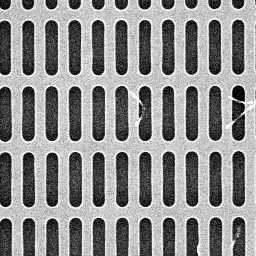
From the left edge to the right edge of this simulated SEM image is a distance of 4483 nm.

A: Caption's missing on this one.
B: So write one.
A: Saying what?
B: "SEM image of groups of lines, slits or small figures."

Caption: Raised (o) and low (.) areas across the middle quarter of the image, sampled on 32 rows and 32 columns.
o...ooo...ooo...oo....oo....oo..
o...ooo...ooo...ooo...oo....oo..
oo..oooo.oooo..oooo..oooo..oooo.
oooooooooooooooooooooooooooooooo
oooooooooooooooooooooooooooooooo
oo.ooooo.ooooo.ooooo.oooooooooo.
o...ooo...ooo...ooo...ooo..ooo..
o...ooo...ooo...oo....oo....oo..
o...ooo...ooo...ooo...oo....oo..
o...ooo...ooo...ooo...oo....oo..
o...ooo...ooo...oo....oo....oo..
o...ooo...ooo...oo....oo....oo..
o...ooo...ooo...oo....oo....oo..
o...ooo...ooo...ooo...oo....oo..
o...ooo...ooo...ooo...oo....oo..
o...ooo...ooo...oo....oo....oo..
o...ooo...ooo...oo....oo....oo..
o...ooo...ooo...oo....oo....oo..
o...ooo...ooo...ooo...ooo..oooo.
oooooooooooooooooooooooooooooooo
oooooooooooooooooooooooooooooooo
oooooooooooooooooooooooooooooooo
oo..ooo...ooo...ooo..oooo..ooo..
o...ooo...ooo...ooo...oo....oo..
o....oo...ooo...ooo...oo....oo..
o....oo...ooo...ooo...oo....oo..
o....oo...ooo...ooo...oo....oo..
o....oo...ooo...ooo...oo....oo..
o....oo...ooo...ooo...oo....oo..
o....oo...ooo...ooo...oo....oo..
o....oo...ooo...ooo...oo....oo..
o....oo...ooo...ooo...oo....oo..